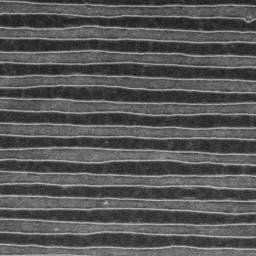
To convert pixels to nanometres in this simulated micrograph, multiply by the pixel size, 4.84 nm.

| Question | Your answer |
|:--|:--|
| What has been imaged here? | parallel lines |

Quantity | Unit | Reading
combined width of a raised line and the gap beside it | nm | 117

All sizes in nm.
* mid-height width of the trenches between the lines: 47.8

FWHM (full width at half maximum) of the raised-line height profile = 67.2 nm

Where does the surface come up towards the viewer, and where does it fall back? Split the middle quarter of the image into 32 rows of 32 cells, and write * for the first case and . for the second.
********************************
********************************
********************************
...................*************
................................
*****..***......................
*************************..***..
********************************
********************************
............********************
................................
................................
******************..............
********************************
********************************
.....*****.*...*****************
................................
................................
**********************..........
********************************
********************************
...............**.*.************
................................
................................
****......********************..
********************************
********************************
..*...**************************
................................
................................
*******..***********.......**...
********************************